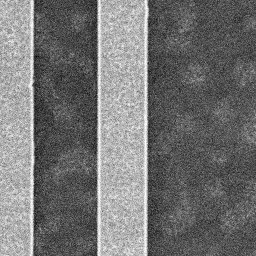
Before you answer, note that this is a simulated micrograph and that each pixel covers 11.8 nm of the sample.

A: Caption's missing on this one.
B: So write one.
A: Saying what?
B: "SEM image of one or a few lines or trenches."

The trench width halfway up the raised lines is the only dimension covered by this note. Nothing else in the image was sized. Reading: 794 nm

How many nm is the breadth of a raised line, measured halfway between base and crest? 551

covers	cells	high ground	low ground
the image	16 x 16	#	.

##....###.......
##....###.......
##....###.......
##....###.......
##....###.......
##....###.......
##....###.......
##....###.......
##....###.......
##....###.......
##....###.......
##....###.......
##....###.......
##....###.......
##....###.......
##....###.......